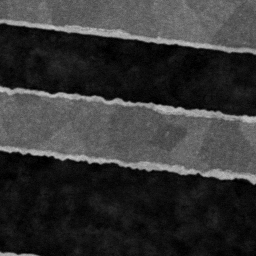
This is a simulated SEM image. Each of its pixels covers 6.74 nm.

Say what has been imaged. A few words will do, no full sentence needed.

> one or a few lines or trenches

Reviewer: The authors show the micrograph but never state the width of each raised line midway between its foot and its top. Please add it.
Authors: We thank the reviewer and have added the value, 408 nm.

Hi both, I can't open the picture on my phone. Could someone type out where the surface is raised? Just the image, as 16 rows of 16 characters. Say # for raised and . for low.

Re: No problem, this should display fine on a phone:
################
.###############
.........#######
................
................
................
########........
################
################
..##############
..........######
................
................
................
................
................